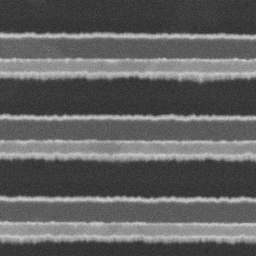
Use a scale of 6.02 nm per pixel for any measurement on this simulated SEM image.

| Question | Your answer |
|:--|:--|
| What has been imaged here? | lines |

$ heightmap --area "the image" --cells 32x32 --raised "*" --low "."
................................
................................
................................
................................
*************************..*....
********************************
********************************
********************************
********************************
................................
................................
................................
................................
................................
................................
********************************
********************************
********************************
********************************
......................*....***..
................................
................................
................................
................................
................................
********************************
********************************
********************************
********************************
********************************
................................
................................